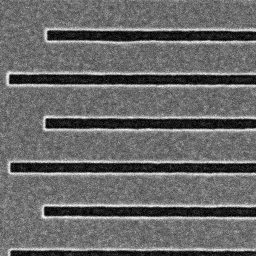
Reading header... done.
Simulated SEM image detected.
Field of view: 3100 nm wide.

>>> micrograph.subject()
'parallel lines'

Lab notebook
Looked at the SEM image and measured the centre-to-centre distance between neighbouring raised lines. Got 532 nm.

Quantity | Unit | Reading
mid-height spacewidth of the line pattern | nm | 124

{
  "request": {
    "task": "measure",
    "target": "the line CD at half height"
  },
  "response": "0.404 microns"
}